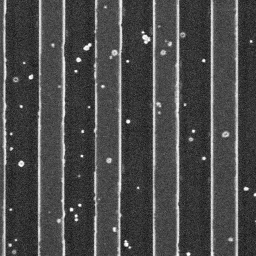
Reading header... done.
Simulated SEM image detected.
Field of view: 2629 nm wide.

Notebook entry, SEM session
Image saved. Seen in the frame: lines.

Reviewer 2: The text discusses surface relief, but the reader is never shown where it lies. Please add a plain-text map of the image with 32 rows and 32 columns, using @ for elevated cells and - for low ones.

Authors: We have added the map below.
@----@@@----@@@----@@@----@@@@--
@----@@@----@@@----@@@----@@@@--
@----@@@----@@@----@@@----@@@@--
@----@@@----@@@----@@@----@@@@--
@----@@@----@@@----@@@----@@@@--
@----@@@----@@@----@@@----@@@@--
@----@@@----@@@----@@@----@@@@--
@----@@@----@@@----@@@----@@@@--
@----@@@----@@@----@@@----@@@@--
@----@@@----@@@----@@@----@@@@--
@----@@@----@@@----@@@----@@@@--
@----@@@----@@@----@@@----@@@@--
@----@@@----@@@----@@@----@@@@--
@----@@@----@@@----@@@----@@@@--
@----@@@----@@@----@@@----@@@@--
@----@@@----@@@----@@@----@@@@--
@----@@@----@@@----@@@----@@@@--
@----@@@----@@@----@@@----@@@@--
@----@@@----@@@----@@@----@@@@--
@----@@@----@@@----@@@----@@@@--
@----@@@----@@@----@@@----@@@@--
@----@@@----@@@----@@@----@@@@--
@----@@@----@@@----@@@----@@@@--
@----@@@----@@@----@@@----@@@@--
@----@@@----@@@----@@@----@@@@--
@----@@@----@@@----@@@----@@@@--
@----@@@----@@@----@@@----@@@@--
@----@@@----@@@----@@@----@@@@--
@----@@@----@@@----@@@----@@@@--
@----@@@----@@@----@@@----@@@@--
@----@@@----@@@----@@@----@@@@--
@----@@@----@@@----@@@----@@@@--